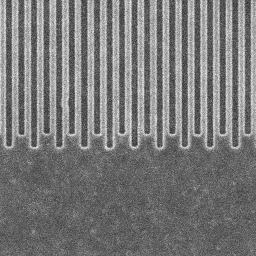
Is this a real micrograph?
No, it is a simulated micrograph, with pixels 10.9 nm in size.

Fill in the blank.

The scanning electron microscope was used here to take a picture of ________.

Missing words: parallel lines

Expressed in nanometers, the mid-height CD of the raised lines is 64.2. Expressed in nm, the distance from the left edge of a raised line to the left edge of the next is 138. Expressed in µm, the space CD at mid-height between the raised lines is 0.0751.